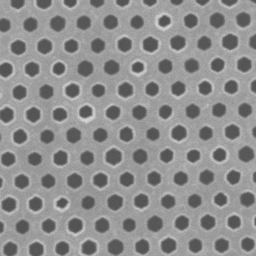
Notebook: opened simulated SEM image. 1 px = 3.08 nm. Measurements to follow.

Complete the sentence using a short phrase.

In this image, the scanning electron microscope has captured a regular array of holes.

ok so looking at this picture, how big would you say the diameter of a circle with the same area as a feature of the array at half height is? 45.7 nm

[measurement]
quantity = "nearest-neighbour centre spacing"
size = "0.0787 microns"